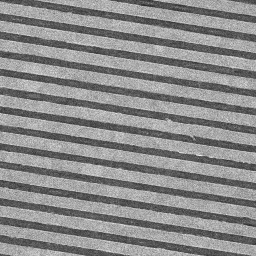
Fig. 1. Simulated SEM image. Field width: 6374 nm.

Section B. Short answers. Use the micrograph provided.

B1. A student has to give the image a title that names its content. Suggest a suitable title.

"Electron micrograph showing parallel lines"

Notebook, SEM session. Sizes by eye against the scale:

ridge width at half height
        268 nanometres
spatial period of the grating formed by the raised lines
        0.454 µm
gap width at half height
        0.203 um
